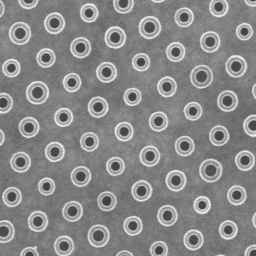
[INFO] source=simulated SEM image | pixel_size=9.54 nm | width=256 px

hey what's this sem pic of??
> a regular array of ring-shaped raised bodies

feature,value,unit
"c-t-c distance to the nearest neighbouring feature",0.34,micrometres